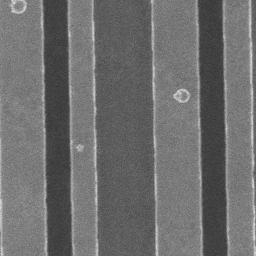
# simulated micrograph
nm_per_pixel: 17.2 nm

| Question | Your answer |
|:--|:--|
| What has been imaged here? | lines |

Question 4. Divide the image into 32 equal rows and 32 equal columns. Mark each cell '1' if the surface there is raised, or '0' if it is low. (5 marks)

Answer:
11111000011100000001111110001110
11111000011100000001111110001110
11111000011100000001111110001110
11111000011100000001111110001110
11111000011100000001111110001110
11111000011100000001111110001110
11111000011100000001111110001110
11111000011100000001111110001110
11111000011100000001111110001110
11111000011100000001111110001110
11111000011100000001111110001110
11111000011100000001111110001110
11111000011100000001111110001110
11111000011100000001111110001110
11111000011100000001111110001110
11111000011100000001111110001111
11111100011100000001111110001111
11111100011100000001111110001111
11111100011100000001111110001111
11111100011100000001111110001111
11111100011100000001111110001111
11111100011100000001111110001111
11111100011100000000111110001111
11111100011100000000111110001111
11111100011100000000111110001111
11111100011100000000111110001111
11111100011100000000111110001111
11111100011100000000111110001111
11111100011100000000111110001111
11111100011100000000111110001111
11111100011100000000111110000111
11111100011100000000111110000111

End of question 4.